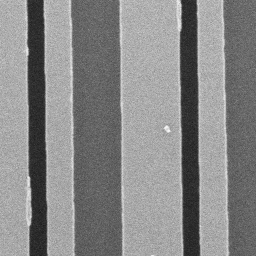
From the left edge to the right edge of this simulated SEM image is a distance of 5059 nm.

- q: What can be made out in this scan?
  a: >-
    lines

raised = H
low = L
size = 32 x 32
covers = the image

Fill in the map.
HHHLLLHHHLLLLLLHHHHHHHHLLHHHLLLL
HHHLLLHHHLLLLLLHHHHHHHHLLHHHLLLL
HHHLLLHHHLLLLLLHHHHHHHHLLHHHLLLL
HHHLLLHHHLLLLLLHHHHHHHHLLHHHLLLL
HHHLLLHHHLLLLLLHHHHHHHLLLHHHLLLL
HHHLLLHHHLLLLLLHHHHHHHLLLHHHLLLL
HHHLLLHHHLLLLLLHHHHHHHLLLHHHLLLL
HHHLLLHHHLLLLLLHHHHHHHLLLHHHLLLL
HHHLLLHHHLLLLLLHHHHHHHLLLHHHLLLL
HHHLLLHHHLLLLLLHHHHHHHLLLHHHLLLL
HHHLLLHHHLLLLLLHHHHHHHHLLHHHLLLL
HHHLLLHHHLLLLLLHHHHHHHHLLHHHLLLL
HHHLLLHHHLLLLLLHHHHHHHHLLHHHLLLL
HHHLLLHHHLLLLLLHHHHHHHHLLHHHLLLL
HHHLLLHHHLLLLLLHHHHHHHHLLHHHLLLL
HHHLLLHHHLLLLLLHHHHHHHHLLHHHLLLL
HHHLLLHHHLLLLLLHHHHHHHHLLHHHLLLL
HHHLLLHHHLLLLLLHHHHHHHHLLHHHLLLL
HHHLLLHHHLLLLLLHHHHHHHHLLHHHLLLL
HHHLLLHHHLLLLLLHHHHHHHHLLHHHLLLL
HHHLLLHHHLLLLLLHHHHHHHHLLHHHLLLL
HHHHLLHHHLLLLLLHHHHHHHHLLHHHLLLL
HHHHLLHHHLLLLLLHHHHHHHHLLHHHLLLL
HHHHLLHHHLLLLLLHHHHHHHHLLHHHLLLL
HHHHLLHHHLLLLLLHHHHHHHHLLHHHLLLL
HHHHLLHHHLLLLLLHHHHHHHHLLHHHLLLL
HHHHLLHHHLLLLLLHHHHHHHHLLHHHLLLL
HHHHLLHHHLLLLLLHHHHHHHHLLHHHLLLL
HHHHLLHHHLLLLLLHHHHHHHHLLHHHLLLL
HHHHLLHHHLLLLLLHHHHHHHHLLHHHLLLL
HHHHLLHHHLLLLLLHHHHHHHHLLHHHLLLL
HHHHLLHHHLLLLLLHHHHHHHHLLHHHLLLL